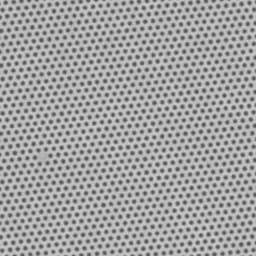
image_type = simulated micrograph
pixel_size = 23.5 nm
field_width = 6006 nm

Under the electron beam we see a regular array of holes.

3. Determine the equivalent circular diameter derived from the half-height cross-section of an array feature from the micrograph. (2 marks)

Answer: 118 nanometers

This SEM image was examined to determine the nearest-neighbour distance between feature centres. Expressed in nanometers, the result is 176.